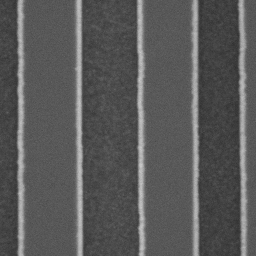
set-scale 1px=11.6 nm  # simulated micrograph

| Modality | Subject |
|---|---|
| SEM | lines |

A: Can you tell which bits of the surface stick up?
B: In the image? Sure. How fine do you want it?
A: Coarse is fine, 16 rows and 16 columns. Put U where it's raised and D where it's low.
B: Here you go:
DUUUUDDDDUUUDDDU
DUUUUDDDDUUUDDDU
DUUUUDDDDUUUDDDU
DUUUUDDDDUUUDDDU
DUUUUDDDDUUUDDDU
DUUUUDDDDUUUDDDU
DUUUUDDDDUUUDDDU
DUUUUDDDDUUUDDDU
DUUUUDDDDUUUDDDU
DUUUUDDDDUUUDDDU
DUUUUDDDDUUUDDDU
DUUUUDDDDUUUDDDU
DUUUUDDDDUUUDDDU
DUUUUDDDDUUUDDDU
DUUUUDDDDUUUDDDU
DUUUUDDDDUUUDDDU